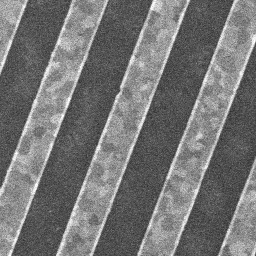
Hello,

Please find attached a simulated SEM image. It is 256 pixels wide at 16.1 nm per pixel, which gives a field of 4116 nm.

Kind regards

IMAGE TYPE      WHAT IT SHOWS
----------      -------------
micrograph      one or a few lines or trenches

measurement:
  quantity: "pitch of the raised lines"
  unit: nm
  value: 1220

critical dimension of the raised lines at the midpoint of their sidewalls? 520 nm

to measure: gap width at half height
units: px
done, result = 43.8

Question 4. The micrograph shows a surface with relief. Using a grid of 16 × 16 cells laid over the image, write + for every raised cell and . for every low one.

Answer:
++..+++..+++...+
+...++...++...++
+...++...++...++
...++...++...+++
...++...++...++.
...++...++...++.
..++...++...++..
..++...++...++..
.++...+++...++..
.++...++...++...
.++...++...++...
++...++...++...+
++...++...++...+
++...++...++...+
+...++...++...++
+...++...++...++